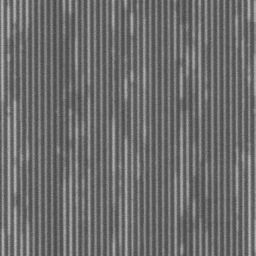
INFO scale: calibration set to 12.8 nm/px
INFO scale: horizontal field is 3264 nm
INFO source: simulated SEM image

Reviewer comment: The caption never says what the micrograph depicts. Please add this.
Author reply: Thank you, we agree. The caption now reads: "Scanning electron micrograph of parallel lines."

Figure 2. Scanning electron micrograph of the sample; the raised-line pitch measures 78.6 nm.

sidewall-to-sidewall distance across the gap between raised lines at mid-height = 59 nm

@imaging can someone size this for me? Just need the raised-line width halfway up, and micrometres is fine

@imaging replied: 0.0207